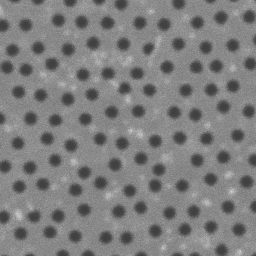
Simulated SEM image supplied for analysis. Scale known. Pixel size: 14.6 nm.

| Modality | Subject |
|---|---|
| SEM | a regular array of holes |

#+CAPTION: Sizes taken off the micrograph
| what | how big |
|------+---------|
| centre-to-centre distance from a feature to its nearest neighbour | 0.328 microns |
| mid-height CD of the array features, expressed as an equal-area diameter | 204 nanometers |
